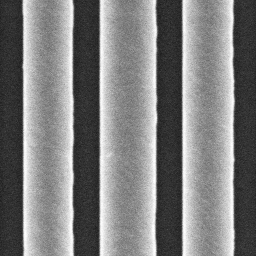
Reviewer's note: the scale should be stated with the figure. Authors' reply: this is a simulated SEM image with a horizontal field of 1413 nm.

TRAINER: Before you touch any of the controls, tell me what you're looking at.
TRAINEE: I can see lines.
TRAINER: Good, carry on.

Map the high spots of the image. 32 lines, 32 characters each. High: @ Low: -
---@@@@@@----@@@@@@----@@@@@@---
---@@@@@@----@@@@@@----@@@@@@---
---@@@@@@----@@@@@@----@@@@@@---
---@@@@@@----@@@@@@@---@@@@@@---
---@@@@@@----@@@@@@@---@@@@@@---
---@@@@@@----@@@@@@----@@@@@@---
---@@@@@@----@@@@@@@---@@@@@@---
---@@@@@@----@@@@@@----@@@@@@---
---@@@@@@----@@@@@@----@@@@@@---
---@@@@@@----@@@@@@----@@@@@@---
---@@@@@@----@@@@@@----@@@@@@---
---@@@@@@----@@@@@@----@@@@@@---
---@@@@@@----@@@@@@@---@@@@@@---
---@@@@@@----@@@@@@----@@@@@@---
---@@@@@@----@@@@@@@---@@@@@@---
---@@@@@@----@@@@@@@---@@@@@@---
---@@@@@@----@@@@@@----@@@@@@---
---@@@@@@----@@@@@@----@@@@@@---
---@@@@@@----@@@@@@----@@@@@@---
---@@@@@@----@@@@@@----@@@@@@---
---@@@@@@----@@@@@@----@@@@@@---
---@@@@@@----@@@@@@----@@@@@@---
---@@@@@@----@@@@@@----@@@@@@---
---@@@@@@----@@@@@@----@@@@@@---
---@@@@@@----@@@@@@----@@@@@@---
---@@@@@@----@@@@@@----@@@@@@---
---@@@@@@----@@@@@@----@@@@@@---
---@@@@@@----@@@@@@----@@@@@@---
---@@@@@@----@@@@@@----@@@@@@---
---@@@@@@----@@@@@@----@@@@@@---
---@@@@@@----@@@@@@----@@@@@@---
---@@@@@@----@@@@@@----@@@@@@---